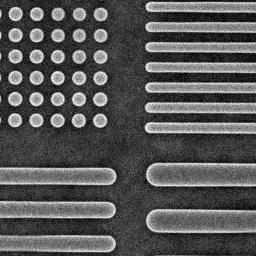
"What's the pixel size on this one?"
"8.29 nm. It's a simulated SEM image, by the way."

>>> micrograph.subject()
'groups of lines, slits or small figures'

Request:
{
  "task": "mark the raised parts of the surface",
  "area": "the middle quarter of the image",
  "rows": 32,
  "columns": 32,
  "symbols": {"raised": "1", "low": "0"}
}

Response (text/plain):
00000000000000000000011111111111
00000000000000000000011111111111
00011000110000000000000000000000
00111000111000000000000000000000
00011000110000000000000000000000
00000000000000000000011111111111
00000000000000000000011111111111
00011000110000000000000000000000
00111000111000000000000000000000
00111000111000000000000000000000
00000000000000000000011111111111
00000000000000000000011111111111
00000000000000000000000000000000
00111000110000000000000000000000
00111000111000000000000000000000
00011000110000000000111111111111
00000000000000000000111111111111
00000000000000000000000000000000
00000000000000000000000000000000
00000000000000000000000000000000
00000000000000000000000000000000
00000000000000000000000000000000
00000000000000000000000000000000
00000000000000000000000000000000
00000000000000000000000000000000
00000000000000000000001111111111
11111111111100000000011111111111
11111111111110000000011111111111
11111111111110000000011111111111
11111111111100000000011111111111
00000000000000000000000000000000
00000000000000000000000000000000